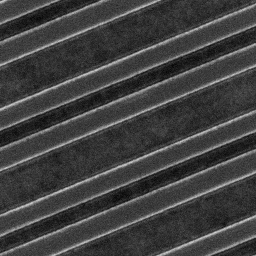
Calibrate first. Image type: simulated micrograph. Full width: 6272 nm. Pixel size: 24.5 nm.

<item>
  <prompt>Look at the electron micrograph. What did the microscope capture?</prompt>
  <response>lines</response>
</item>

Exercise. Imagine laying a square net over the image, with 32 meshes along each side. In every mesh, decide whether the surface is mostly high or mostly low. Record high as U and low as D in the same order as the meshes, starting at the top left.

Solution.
UUUUUUDDDDDDUUUUUUUDDDDDDDDDDDDD
UUUUDDDDDUUUUUUUUDDDDDDDDDDDDDUU
UDDDDDDUUUUUUUDDDDDDDDDDDDDUUUUU
DDDDUUUUUUUUDDDDDDDDDDDDDUUUUUUD
DDUUUUUUUDDDDDDDDDDDDDUUUUUUUDDD
UUUUUUUDDDDDDDDDDDDDUUUUUUDDDDDD
UUUUDDDDDDDDDDDDDUUUUUUUDDDDDUUU
UUDDDDDDDDDDDDDUUUUUUDDDDDDUUUUU
DDDDDDDDDDDDDUUUUUUDDDDDUUUUUUUD
DDDDDDDDDDUUUUUUUDDDDDUUUUUUUDDD
DDDDDDDUUUUUUUDDDDDUUUUUUUDDDDDD
DDDDDUUUUUUUDDDDDUUUUUUUDDDDDDDD
DDDUUUUUUDDDDDDUUUUUUDDDDDDDDDDD
UUUUUUUDDDDDUUUUUUUDDDDDDDDDDDDD
UUUUDDDDDDUUUUUUUDDDDDDDDDDDDDUU
UUDDDDDUUUUUUUDDDDDDDDDDDDDDUUUU
DDDDDUUUUUUUDDDDDDDDDDDDDUUUUUUU
DDDUUUUUUUDDDDDDDDDDDDDUUUUUUDDD
UUUUUUUDDDDDDDDDDDDDUUUUUUUDDDDD
UUUUUDDDDDDDDDDDDDUUUUUUDDDDDDUU
UUDDDDDDDDDDDDDDUUUUUUDDDDDUUUUU
DDDDDDDDDDDDDUUUUUUUDDDDDUUUUUUU
DDDDDDDDDDDUUUUUUDDDDDDUUUUUUUDD
DDDDDDDDUUUUUUUDDDDDUUUUUUUDDDDD
DDDDDDUUUUUUDDDDDDUUUUUUUDDDDDDD
DDDDUUUUUUDDDDDUUUUUUUUDDDDDDDDD
DUUUUUUDDDDDDUUUUUUUDDDDDDDDDDDD
UUUUUDDDDDUUUUUUUUDDDDDDDDDDDDDU
UUDDDDDDUUUUUUUDDDDDDDDDDDDDUUUU
DDDDDUUUUUUUUDDDDDDDDDDDDDUUUUUU
DDDUUUUUUUDDDDDDDDDDDDDUUUUUUUDD
DUUUUUUUDDDDDDDDDDDDDUUUUUUDDDDD